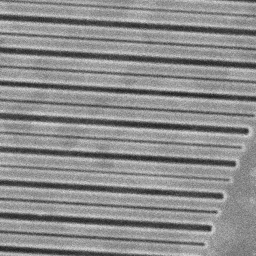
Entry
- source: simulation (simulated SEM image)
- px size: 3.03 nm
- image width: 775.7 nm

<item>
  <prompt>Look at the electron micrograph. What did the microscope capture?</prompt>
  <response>parallel lines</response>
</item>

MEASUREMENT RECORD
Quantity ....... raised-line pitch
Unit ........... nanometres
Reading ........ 50.1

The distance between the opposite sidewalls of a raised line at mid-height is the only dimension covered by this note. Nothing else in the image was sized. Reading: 0.034 micrometres